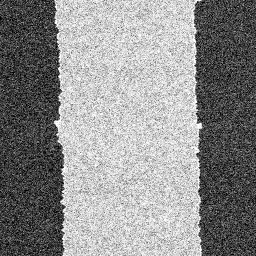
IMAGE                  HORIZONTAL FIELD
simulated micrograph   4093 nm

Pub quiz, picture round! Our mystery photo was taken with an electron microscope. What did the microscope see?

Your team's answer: one or a few lines or trenches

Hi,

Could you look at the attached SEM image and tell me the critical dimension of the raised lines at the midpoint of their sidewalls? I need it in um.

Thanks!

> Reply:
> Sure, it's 2.17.